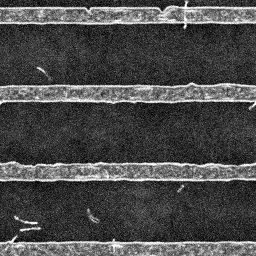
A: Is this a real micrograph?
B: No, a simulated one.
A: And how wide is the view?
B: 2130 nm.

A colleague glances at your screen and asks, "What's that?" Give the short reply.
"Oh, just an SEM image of one or a few lines or trenches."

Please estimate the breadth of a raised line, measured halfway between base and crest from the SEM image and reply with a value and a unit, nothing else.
128 nanometers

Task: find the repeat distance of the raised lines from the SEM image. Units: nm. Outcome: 651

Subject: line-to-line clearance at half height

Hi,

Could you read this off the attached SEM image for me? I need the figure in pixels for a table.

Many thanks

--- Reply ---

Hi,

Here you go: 62.2